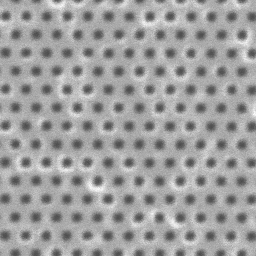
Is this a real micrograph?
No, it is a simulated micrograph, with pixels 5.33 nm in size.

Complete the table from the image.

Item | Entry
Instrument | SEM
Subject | a regular array of holes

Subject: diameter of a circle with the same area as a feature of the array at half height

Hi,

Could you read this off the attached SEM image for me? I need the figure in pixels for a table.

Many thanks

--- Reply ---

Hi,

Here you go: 11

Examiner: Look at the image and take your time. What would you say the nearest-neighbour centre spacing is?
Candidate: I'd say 0.109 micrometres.